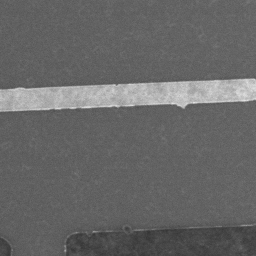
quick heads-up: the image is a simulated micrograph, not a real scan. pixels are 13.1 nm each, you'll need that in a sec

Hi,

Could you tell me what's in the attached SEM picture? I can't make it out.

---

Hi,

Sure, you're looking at one or a few lines or trenches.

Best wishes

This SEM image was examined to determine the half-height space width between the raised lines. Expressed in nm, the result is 1640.